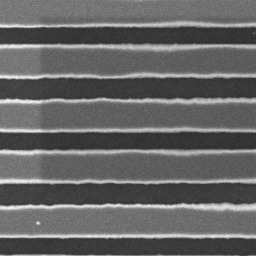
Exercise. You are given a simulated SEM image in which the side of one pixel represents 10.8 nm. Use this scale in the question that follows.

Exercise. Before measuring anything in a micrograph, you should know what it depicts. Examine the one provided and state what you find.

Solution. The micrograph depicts lines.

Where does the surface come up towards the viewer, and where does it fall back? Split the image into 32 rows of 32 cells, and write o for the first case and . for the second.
oooooooooooooooooooooooooooooooo
oooooooooooooooooooooooooooooooo
oooooooooooooooooooooooooooooooo
................................
................................
................................
oooooooooooooooooooooooooooooooo
oooooooooooooooooooooooooooooooo
oooooooooooooooooooooooooooooooo
oooooooooooooooooooooooooooooooo
................................
................................
ooo...oooooooooooooooooooooooooo
oooooooooooooooooooooooooooooooo
oooooooooooooooooooooooooooooooo
oooooooooooooooooooooooooooooooo
...oooo......o.ooo.............o
................................
................................
oooooooooooooooooooooooooooooooo
oooooooooooooooooooooooooooooooo
oooooooooooooooooooooooooooooooo
oooooooooooooooooooooooooooooooo
................................
................................
.............o........oo....o...
oooooooooooooooooooooooooooooooo
oooooooooooooooooooooooooooooooo
oooooooooooooooooooooooooooooooo
oooooooooooooooooooooooooooooooo
................................
................................